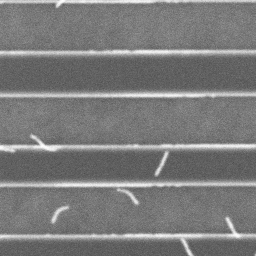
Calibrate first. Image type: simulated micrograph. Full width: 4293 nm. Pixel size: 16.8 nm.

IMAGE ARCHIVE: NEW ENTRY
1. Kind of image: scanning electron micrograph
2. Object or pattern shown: lines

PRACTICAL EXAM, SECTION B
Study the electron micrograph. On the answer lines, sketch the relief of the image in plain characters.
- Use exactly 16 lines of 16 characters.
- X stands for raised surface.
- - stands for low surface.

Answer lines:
----------------
----------------
----------------
XXXXXXXXXXXXXXXX
XXXXXXXXXXXXXXXX
XXXXXXXXXXXXXXXX
----------------
----------------
----------------
XXXXXXXXXXXXXXXX
XXXXXXXXXXXXXXXX
XXXXXXXXXXXXXXXX
----------------
----------------
----------------
XXXXXXXXXXXXXXXX